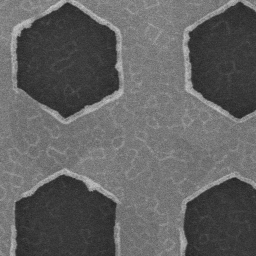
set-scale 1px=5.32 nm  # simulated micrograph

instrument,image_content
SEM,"holes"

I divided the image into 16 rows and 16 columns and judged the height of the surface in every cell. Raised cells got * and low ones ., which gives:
****.*********..
**....*******...
*......*****....
*......*****....
*......*****....
*......*****....
***...*******...
****************
****************
****************
****************
***..*********..
*......*****....
*......****.....
*......*****....
*......*****....